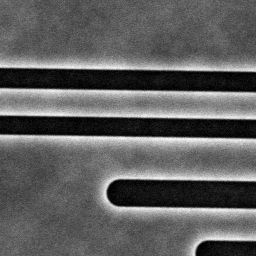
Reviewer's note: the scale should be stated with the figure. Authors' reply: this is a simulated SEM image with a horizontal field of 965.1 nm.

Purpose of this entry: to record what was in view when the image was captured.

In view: groups of lines, slits or small figures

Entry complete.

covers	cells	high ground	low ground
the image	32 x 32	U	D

UUUUUUUUUUUUUUUUUUUUUUUUUUUUUUUU
UUUUUUUUUUUUUUUUUUUUUUUUUUUUUUUU
UUUUUUUUUUUUUUUUUUUUUUUUUUUUUUUU
UUUUUUUUUUUUUUUUUUUUUUUUUUUUUUUU
UUUUUUUUUUUUUUUUUUUUUUUUUUUUUUUU
UUUUUUUUUUUUUUUUUUUUUUUUUUUUUUUU
UUUUUUUUUUUUUUUUUUUUUUUUUUUUUUUU
UUUUUUUUUUUUUUUUUUUUUUUUUUUUUUUU
DDDDUUUUUUUUUUUUUUUUUUUUUUUUUUUU
DDDDDDDDDDDDDDDDDDDDDDDDDDDDDDDD
DDDDDDDDDDDDDDDDDDDDDDDDDDDDDDDD
UUUUUUUUUUUUUUUUUUUUUUUDDDDDDDDD
UUUUUUUUUUUUUUUUUUUUUUUUUUUUUUUU
UUUUUUUUUUUUUUUUUUUUUUUUUUUUUUUU
DDDDDDDUUUUUUUUUUUUUUUUUUUUUUUUU
DDDDDDDDDDDDDDDDDDDDDDDDDDDDDDDD
DDDDDDDDDDDDDDDDDDDDDDDDDDDDDDDD
UUUUUUUUUUUUUUUUUUUUUUUUUUUUUUUU
UUUUUUUUUUUUUUUUUUUUUUUUUUUUUUUU
UUUUUUUUUUUUUUUUUUUUUUUUUUUUUUUU
UUUUUUUUUUUUUUUUUUUUUUUUUUUUUUUU
UUUUUUUUUUUUUUUUUUUUUUUUUUUUUUUU
UUUUUUUUUUUUUUDDDDDDDDDDDUUUUUUU
UUUUUUUUUUUUUDDDDDDDDDDDDDDDDDDD
UUUUUUUUUUUUUDDDDDDDDDDDDDDDDDDD
UUUUUUUUUUUUUUDDDDDDDDDDDDDDDDDD
UUUUUUUUUUUUUUUUUUUUUUUUUUUUUUUU
UUUUUUUUUUUUUUUUUUUUUUUUUUUUUUUU
UUUUUUUUUUUUUUUUUUUUUUUUUUUUUUUU
UUUUUUUUUUUUUUUUUUUUUUUUUUUUUUUU
UUUUUUUUUUUUUUUUUUUUUUUUUDDDDDDD
UUUUUUUUUUUUUUUUUUUUUUUUDDDDDDDD